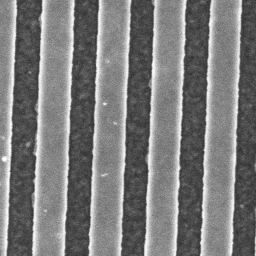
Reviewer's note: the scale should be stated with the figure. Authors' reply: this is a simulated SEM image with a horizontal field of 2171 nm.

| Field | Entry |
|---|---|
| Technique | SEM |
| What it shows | lines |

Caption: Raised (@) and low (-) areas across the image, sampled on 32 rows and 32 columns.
@@---@@@@---@@@@---@@@@---@@@@--
@@---@@@@---@@@@---@@@@---@@@@--
@@---@@@@---@@@@---@@@@---@@@@--
@@---@@@@---@@@@---@@@@---@@@@--
@@---@@@@---@@@@---@@@@---@@@@--
@@---@@@@---@@@@---@@@@---@@@@--
@@---@@@@---@@@@---@@@@---@@@@--
@@---@@@@---@@@@---@@@@---@@@@--
@@---@@@@---@@@@---@@@@---@@@@--
@@---@@@@---@@@@---@@@@---@@@@--
@@---@@@@---@@@@---@@@@---@@@@--
@@---@@@@---@@@@---@@@@---@@@@--
@@---@@@@---@@@@---@@@@---@@@@--
@@---@@@@---@@@@---@@@@---@@@@--
@----@@@@---@@@@---@@@@---@@@@--
@----@@@@---@@@@---@@@@---@@@@--
@----@@@@---@@@@---@@@@---@@@@--
@----@@@@---@@@@---@@@@---@@@@--
@----@@@@---@@@@---@@@----@@@---
@----@@@@---@@@@---@@@----@@@---
@----@@@@---@@@@---@@@---@@@@---
@---@@@@@--@@@@@---@@@----@@@---
@---@@@@---@@@@----@@@---@@@@---
@---@@@@---@@@@---@@@@---@@@@---
@---@@@@---@@@@---@@@@---@@@@---
@---@@@@---@@@@---@@@@---@@@@---
@---@@@@---@@@@---@@@@---@@@@---
@---@@@@---@@@@---@@@@---@@@@---
@---@@@@---@@@@---@@@@---@@@@---
@---@@@@---@@@@---@@@@---@@@@---
@---@@@@---@@@@---@@@@---@@@@---
@---@@@@---@@@@---@@@@---@@@@---